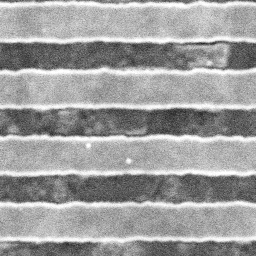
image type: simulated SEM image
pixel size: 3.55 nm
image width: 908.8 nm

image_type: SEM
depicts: lines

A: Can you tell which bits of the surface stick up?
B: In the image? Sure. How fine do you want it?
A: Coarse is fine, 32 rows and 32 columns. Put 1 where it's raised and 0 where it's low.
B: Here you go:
11111111111110001111111011101111
11111111111111111111111111111111
11111111111111111111111111111111
11111111111111111111111111111111
11111111111111111111111111111111
00000000000000000000000000000000
00000000000000000000000000000000
00000000000000000000000000000000
00000000000000000000000000000000
11111111111111111111111111111111
11111111111111111111111111111111
11111111111111111111111111111111
11111111111111111111111111111111
11111111001110011111110010111111
00000000000000000000000000000000
00000000000000000000000000000000
00000000000000000000000000000000
11111111111111111111111111111111
11111111111111111111111111111111
11111111111111111111111111111111
11111111111111111111111111111111
11111111111111111111111111111111
00000000000000000000000000000000
00000000000000000000000000000000
00000000000000000000000000000000
11111110111111111111111111111111
11111111111111111111111111111111
11111111111111111111111111111111
11111111111111111111111111111111
11111111111111111111111111111111
00000000000000000000000000000000
00000000000000000000000000000000